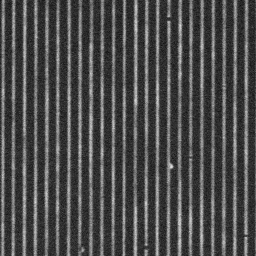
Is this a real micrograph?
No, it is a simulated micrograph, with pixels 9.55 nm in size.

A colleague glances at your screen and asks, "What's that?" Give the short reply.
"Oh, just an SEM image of parallel lines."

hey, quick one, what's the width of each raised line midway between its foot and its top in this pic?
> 19.1 nm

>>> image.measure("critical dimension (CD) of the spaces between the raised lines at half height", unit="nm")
86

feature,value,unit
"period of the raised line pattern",106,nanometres